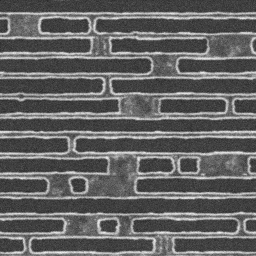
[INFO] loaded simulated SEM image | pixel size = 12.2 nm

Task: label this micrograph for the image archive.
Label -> parallel lines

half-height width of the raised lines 55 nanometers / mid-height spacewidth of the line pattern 186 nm